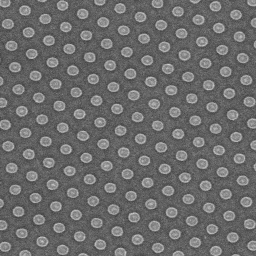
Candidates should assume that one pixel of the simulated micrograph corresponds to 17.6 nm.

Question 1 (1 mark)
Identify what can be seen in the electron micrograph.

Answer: a regular array of raised bodies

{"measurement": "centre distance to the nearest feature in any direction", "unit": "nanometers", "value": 379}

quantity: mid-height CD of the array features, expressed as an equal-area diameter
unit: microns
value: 0.182